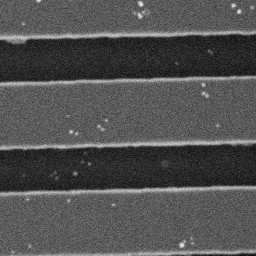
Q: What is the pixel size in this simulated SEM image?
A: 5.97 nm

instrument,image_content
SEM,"lines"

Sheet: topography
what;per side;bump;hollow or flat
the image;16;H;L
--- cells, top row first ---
HHHHHHHHHHHHHHHH
HHHHHHHHHHHHHHHH
LLLLLLLLLLLLLLLL
LLLLLLLLLLLLLLLL
LLLLLLLLLLLLLLLL
HHHHHHHHHHHHHHHH
HHHHHHHHHHHHHHHH
HHHHHHHHHHHHHHHH
HHHHHHHHHHHHHHHH
LLLLLLLLLLLLLLLL
LLLLLLLLLLLLLLLL
LLLLLLLLLLLLLLLL
HHHHHHHHHHHHHHHH
HHHHHHHHHHHHHHHH
HHHHHHHHHHHHHHHH
HHHHHHHHHHHHHHHH